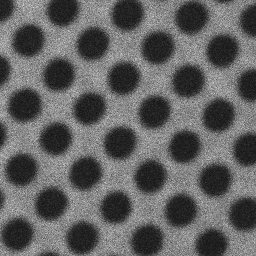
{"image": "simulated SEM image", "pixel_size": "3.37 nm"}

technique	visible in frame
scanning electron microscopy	a regular array of holes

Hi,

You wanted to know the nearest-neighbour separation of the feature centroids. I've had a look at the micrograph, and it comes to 153 nm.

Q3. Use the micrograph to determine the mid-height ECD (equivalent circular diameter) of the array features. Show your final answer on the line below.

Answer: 110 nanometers